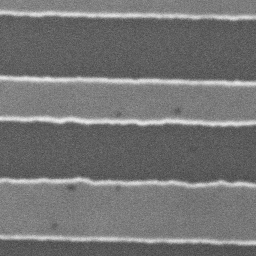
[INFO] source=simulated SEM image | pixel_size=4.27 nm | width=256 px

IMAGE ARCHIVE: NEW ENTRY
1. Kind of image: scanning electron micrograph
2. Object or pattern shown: lines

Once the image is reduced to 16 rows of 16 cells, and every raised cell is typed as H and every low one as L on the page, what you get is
HHHHHHHHHHHHHHHH
LLLLLLLLLLLLLLLL
LLLLLLLLLLLLLLLL
LLLLLLLLLLLLLLLL
LLLLLLLLLLLLLLLL
HHHHHHHHHHHHHHHH
HHHHHHHHHHHHHHHH
LHLHHHHHHHHHHHHH
LLLLLLLLLLLLLLLL
LLLLLLLLLLLLLLLL
LLLLLLLLLLLLLLLL
HHHHHHHHHHHHLHHH
HHHHHHHHHHHHHHHH
HHHHHHHHHHHHHHHH
HHHHHHHHHHHHHHHH
LLLLLLLLLLLLLLLL